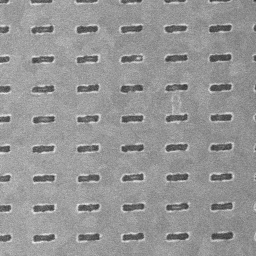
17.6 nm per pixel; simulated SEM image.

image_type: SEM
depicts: a regular array of holes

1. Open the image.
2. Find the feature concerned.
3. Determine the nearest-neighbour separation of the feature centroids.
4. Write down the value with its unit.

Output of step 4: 0.52 um